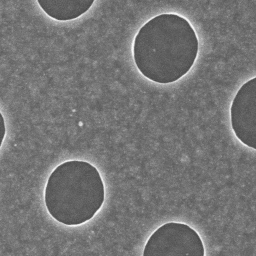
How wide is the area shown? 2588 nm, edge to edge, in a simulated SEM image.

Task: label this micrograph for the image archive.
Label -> holes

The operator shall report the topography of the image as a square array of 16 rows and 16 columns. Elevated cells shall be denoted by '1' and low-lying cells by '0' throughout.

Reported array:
1110001111111111
1111111110001111
1111111100001111
1111111100001111
1111111110001111
1111111111111110
1111111111111110
1111111111111100
1111111111111110
1111111111111111
1111001111111111
1110001111111111
1110001111111111
1110001111111111
1111111111001111
1111111110000111